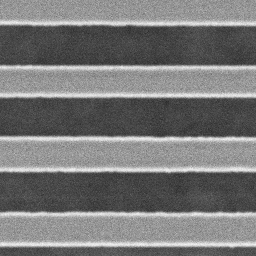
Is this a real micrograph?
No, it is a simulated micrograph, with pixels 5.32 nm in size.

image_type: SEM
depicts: lines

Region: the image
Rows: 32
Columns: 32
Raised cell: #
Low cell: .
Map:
################################
################################
################################
................................
................................
................................
................................
................................
################################
################################
################################
################################
................................
................................
................................
................................
................................
################################
################################
################################
################################
.....................#..........
................................
................................
................................
................................
................................
################################
################################
################################
################################
................................